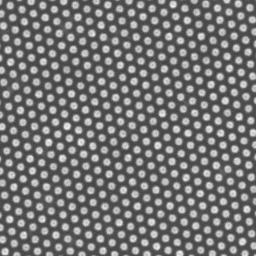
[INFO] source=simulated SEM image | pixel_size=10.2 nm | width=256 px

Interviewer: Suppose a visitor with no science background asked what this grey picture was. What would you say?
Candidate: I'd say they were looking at a regular array of raised bodies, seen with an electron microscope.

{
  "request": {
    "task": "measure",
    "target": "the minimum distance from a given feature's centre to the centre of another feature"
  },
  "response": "123 nm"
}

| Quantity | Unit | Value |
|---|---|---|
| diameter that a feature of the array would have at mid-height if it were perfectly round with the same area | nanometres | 66.9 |